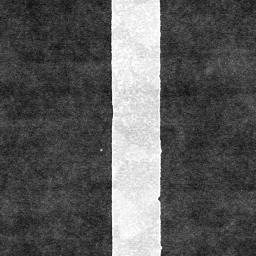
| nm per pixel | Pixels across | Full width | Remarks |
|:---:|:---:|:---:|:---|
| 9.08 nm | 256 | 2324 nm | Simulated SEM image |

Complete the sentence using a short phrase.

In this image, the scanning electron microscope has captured one or a few lines or trenches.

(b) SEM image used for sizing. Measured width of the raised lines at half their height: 429 nm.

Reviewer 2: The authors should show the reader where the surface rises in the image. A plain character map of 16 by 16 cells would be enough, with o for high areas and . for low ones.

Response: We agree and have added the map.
.......ooo......
.......ooo......
.......ooo......
.......ooo......
.......ooo......
.......ooo......
.......ooo......
.......ooo......
.......ooo......
.......ooo......
.......ooo......
.......ooo......
.......ooo......
.......ooo......
.......ooo......
.......ooo......